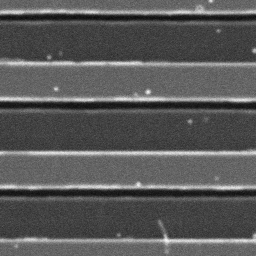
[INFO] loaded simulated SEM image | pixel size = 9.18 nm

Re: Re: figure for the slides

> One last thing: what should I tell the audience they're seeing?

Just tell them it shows lines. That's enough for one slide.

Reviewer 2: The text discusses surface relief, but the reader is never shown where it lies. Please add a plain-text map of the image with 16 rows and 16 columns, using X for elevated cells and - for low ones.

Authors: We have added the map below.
XXXXXXXXXXXXXXXX
----------------
----------------
----------------
XXXXXXXXXXXXXXXX
XXXXXXXXXXXXXXXX
----------------
----------------
----------------
----------------
XXXXXXXXXXXXXXXX
XXXXXXXXXXXXXXXX
----------------
----------------
----------------
XXXXXXXXXXXXXXXX